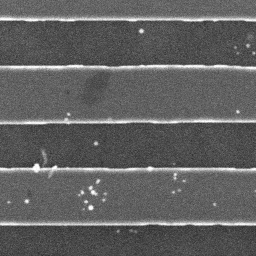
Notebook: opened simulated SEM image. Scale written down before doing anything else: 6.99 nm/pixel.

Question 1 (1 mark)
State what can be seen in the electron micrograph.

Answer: lines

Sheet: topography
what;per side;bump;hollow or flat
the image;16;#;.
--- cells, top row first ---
################
................
................
................
################
################
################
################
................
................
..##.....#......
################
################
################
................
................